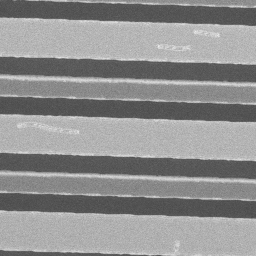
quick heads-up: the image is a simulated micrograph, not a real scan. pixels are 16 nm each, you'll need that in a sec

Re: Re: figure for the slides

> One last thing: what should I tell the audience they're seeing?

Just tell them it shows lines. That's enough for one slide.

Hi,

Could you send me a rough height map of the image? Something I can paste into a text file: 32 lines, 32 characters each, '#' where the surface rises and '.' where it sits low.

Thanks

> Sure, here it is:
..................##############
................................
#########.......................
################################
################################
################################
################################
..................##############
................................
##..............................
################################
################################
...............#################
................................
########........................
################################
################################
################################
################################
..............##################
................................
##..............................
################################
################################
..............##################
................................
######..........................
################################
################################
################################
################################
.......#########################